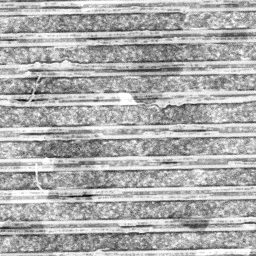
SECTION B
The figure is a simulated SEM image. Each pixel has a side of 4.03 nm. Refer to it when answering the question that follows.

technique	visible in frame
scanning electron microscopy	parallel lines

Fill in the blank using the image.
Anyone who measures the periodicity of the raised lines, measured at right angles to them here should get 31.3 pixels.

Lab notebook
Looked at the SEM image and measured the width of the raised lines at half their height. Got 10.4 pixels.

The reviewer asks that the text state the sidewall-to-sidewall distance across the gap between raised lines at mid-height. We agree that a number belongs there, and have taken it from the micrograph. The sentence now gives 0.0841 microns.